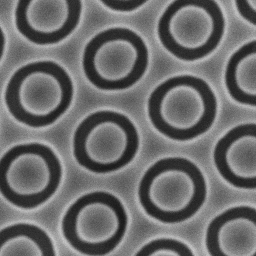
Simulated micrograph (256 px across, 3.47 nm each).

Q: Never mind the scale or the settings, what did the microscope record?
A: ring-shaped grooves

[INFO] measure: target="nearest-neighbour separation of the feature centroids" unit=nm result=285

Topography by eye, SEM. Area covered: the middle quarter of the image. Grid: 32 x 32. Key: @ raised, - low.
@@@@@---@@@@@@@@@----@@@@@@@@@@@
@@@@@---@@@@@@@@@----@@@@@@@@@@@
-@@@@----@@@@@@@----@@@@@@@@@@@@
--@@@@----@@@@-----@@@@@@@------
--@@@@@-----------@@@@@@@-------
--@@@@@@---------@@@@@@---------
--@@@@@@@@----@@@@@@@@-----@@@@@
--@@@@@@@@@@@@@@@@@@@@----@@@@@@
--@@@@@@@@@@@@@@@@@@@----@@@@@@@
--@@@@@@@@@@@@@@@@@@@----@@@@@@@
-@@@@@@@@@@@@@@@@@@@@----@@@@@@@
-@@@@@@@@--@@@@@@@@@@---@@@@@@@@
@@@@@@@--------@@@@@@---@@@@@@@@
@@@@@-----------@@@@@----@@@@@@@
@@@@-------------@@@@@----@@@@@@
@@@-----@@@@@-----@@@@------@@@@
@@@----@@@@@@@----@@@@@---------
@@-----@@@@@@@@----@@@@@@-------
@@----@@@@@@@@@----@@@@@@@------
@@----@@@@@@@@@----@@@@@@@@@@@@@
@@----@@@@@@@@@----@@@@@@@@@@@@@
@@----@@@@@@@@@---@@@@@@@@@@@@@@
@@----@@@@@@@@----@@@@@@@@@@@@@@
@@@----@@@@@@@----@@@@@@@------@
@@@------@@@-----@@@@@@---------
@@@@-----------@@@@@@@----------
@@@@@@-------@@@@@@@@-----------
@@@@@@@@@-@@@@@@@@@@----@@@@@@--
@@@@@@@@@@@@@@@@@@@----@@@@@@@@-
@@@@@@@@@@@@@@@@@@@---@@@@@@@@@@
@@@@@@@@@@@@@@@@@@@---@@@@@@@@@@
@@@@@@@@@@@@@@@@@@----@@@@@@@@@@